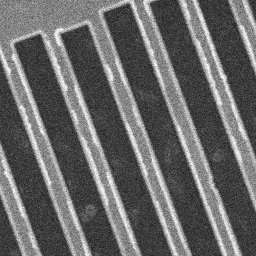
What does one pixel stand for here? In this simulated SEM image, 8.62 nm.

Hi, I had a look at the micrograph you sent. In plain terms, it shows parallel lines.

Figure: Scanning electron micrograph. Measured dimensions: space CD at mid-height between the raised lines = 0.267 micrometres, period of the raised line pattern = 404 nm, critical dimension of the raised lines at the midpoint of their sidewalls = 135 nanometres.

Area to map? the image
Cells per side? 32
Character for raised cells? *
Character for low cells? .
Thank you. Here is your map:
***************.***....**....**.
*************....**....**....**.
*************....**....**.....**
*********..**....***....**....**
****.**.....**....**....**....**
**....**....**....**.....**....*
**....**....**.....**....**....*
**....**.....**....**....**....*
.**....**....**....**.....**....
.**....**....***....**....**....
.**.....**....**....**....**....
..**....**....**....**.....**...
..**....**.....**....**....**...
..**.....**....**....**....***..
...**....**....**.....**....**..
...**....**.....**....**....**..
....**....**....**....**.....**.
....**....**....**.....**....**.
....**....***....**....**....**.
.....**....**....**....**.....**
*....**....**.....**....**....**
*....**.....**....**....**....**
**....**....**....**....**.....*
**....**....**.....**....**....*
**....***....**....**....**.....
.**....**....**....**.....**....
.**....**....**.....**....**....
.**.....**....**....**....**....
..**....**....**....***....**...
..**....**.....**....**....**...
..***....**....**....**....**...
...**....**....**.....**....**..